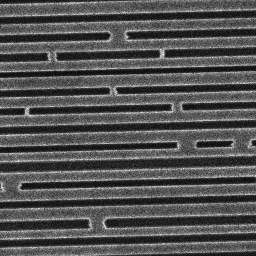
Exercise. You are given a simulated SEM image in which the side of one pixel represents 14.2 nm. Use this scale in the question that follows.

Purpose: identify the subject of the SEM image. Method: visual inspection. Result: parallel lines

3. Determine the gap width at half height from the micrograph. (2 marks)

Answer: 0.0937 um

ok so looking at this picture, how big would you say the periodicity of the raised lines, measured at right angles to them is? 264 nanometers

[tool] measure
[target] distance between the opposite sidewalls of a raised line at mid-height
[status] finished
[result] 163 nanometres